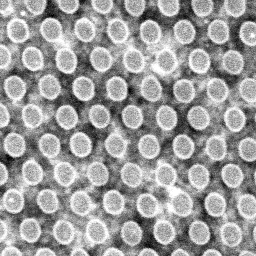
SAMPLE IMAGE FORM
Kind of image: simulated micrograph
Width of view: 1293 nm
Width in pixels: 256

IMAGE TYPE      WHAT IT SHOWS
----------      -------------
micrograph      a regular array of raised bodies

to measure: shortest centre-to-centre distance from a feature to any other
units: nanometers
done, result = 163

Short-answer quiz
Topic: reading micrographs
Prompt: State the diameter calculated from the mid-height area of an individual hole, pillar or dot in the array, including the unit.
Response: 109 nanometres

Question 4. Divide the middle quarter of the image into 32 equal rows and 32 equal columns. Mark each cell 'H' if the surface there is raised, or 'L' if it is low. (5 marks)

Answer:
HHHLLLLHHHHHLLLHHHHHLLLHHHHHLLLL
HHLLLLLLLHHLLLLLHHHLLLLLHHHLLLLL
LLLLLLLLLLLLLLLLLLLLLLLLLLLLLLLL
LLLLHHLLLLLLHHLLLLLLLHLLLLLLLLLL
LLHHHHHLLLLHHHHLLLLLHHHHLLLLHHHL
LLHHHHHLLLLHHHHLLLLHHHHHLLLLHHHH
LLHHHHHLLLLHHHHHLLLHHHHHLLLLHHHH
LLLHHHHLLLLHHHHLLLLLHHHHLLLLHHHH
LLLLHHHLLLLLHHHLLLLLHHHHLLLLHHHH
LLLLLLLLLLLLLLLLLLLLLLLLLLLLLLLL
LLLLLLLLHHLLLLLLLLLLLLLLLLLLLLLL
HHLLLLLHHHHLLLLHHHHLLLLLHHHLLLLL
HHHLLLHHHHHLLLLHHHHLLLLHHHHHLLLH
HHHLLLHHHHHLLLLHHHHLLLLHHHHHLLLH
HHHLLLLHHHHLLLLHHHHLLLLHHHHHLLLH
HHLLLLLLHHLLLLLLHHHLLLLLHHHLLLLL
LLLLLLLLLLLLLLLLLLLLLLLLLLLLLLLL
LLLHHLLLLLLLLLLLLLLLLLLLLLLLLLLL
LLHHHHLLLLLHHHHLLLLLHHHLLLLLHHHL
LLHHHHLLLLLHHHHLLLLHHHHLLLLLHHHH
LLHHHHLLLLLHHHHLLLLHHHHHLLLLHHHH
LLHHHHLLLLLHHHHLLLLHHHHHLLLLHHHH
LLLHHHLLLLLLHHHLLLLHHHHLLLLLHHHH
LLLLLLLLLLLLLLLLLLLLLLLLLLLLLLLL
LLLLLLLLLLLLLLLLLLLLLLLLLLLLLLLL
HHLLLLLHHHLLLLLHHHLLLLLLHHLLLLLL
HHLLLLHHHHHLLLHHHHHLLLLHHHHLLLLL
HHHLLLHHHHHLLLHHHHHLLLLHHHHHLLLH
HHHLLLHHHHHLLLHHHHHLLLLHHHHHLLLH
HHLLLLLHHHLLLLLHHHHLLLLLHHHHLLLL
LLLLLLLLLLLLLLLLHHLLLLLLLHHLLLLL
LLLLLLLLLLLLLLLLLLLLLLLLLLLLLLLL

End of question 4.